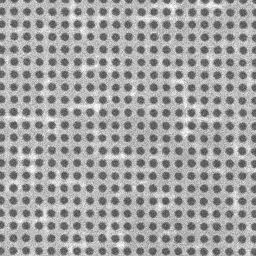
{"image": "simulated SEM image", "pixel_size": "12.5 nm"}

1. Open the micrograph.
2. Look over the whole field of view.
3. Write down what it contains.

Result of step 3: a regular array of holes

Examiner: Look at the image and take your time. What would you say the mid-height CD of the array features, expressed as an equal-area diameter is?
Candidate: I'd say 0.11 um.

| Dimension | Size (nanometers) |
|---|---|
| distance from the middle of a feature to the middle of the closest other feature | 154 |